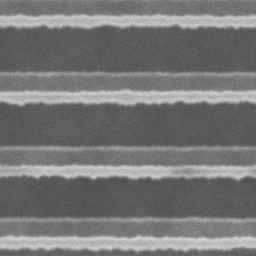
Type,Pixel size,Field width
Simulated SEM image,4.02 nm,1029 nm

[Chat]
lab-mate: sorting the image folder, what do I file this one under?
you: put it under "lines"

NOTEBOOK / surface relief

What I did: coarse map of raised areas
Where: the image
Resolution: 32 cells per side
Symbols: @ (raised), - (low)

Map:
@@@@@@@@@@@@@@@@@@@@@@@@@@@@@@@@
@@@@@@@@@@@@@@@@@@@@@@@@@@@@@@@@
@@@@@@@@@@@@@@@@@@@@@@@@@@@@@@@@
--------------------------------
--------------------------------
--------------------------------
--------------------------------
--------------------------------
--------------------------------
@@@@@@@@@@@@@@@@@@@@@@@@@@@@@@@@
@@@@@@@@@@@@@@@@@@@@@@@@@@@@@@@@
@@@@@@@@@@@@@@@@@@@@@@@@@@@@@@@@
@@@@@@@@@@@@@@@@@@@@@@@@@@@@@@@@
--------------------------------
--------------------------------
--------------------------------
--------------------------------
--------------------------------
@@@@@@@@----@@@----@@@--@@---@@@
@@@@@@@@@@@@@@@@@@@@@@@@@@@@@@@@
@@@@@@@@@@@@@@@@@@@@@@@@@@@@@@@@
@@@@@@@@@@@@@@@@@@@@@@@@@@@@@@@@
--------------------------------
--------------------------------
--------------------------------
--------------------------------
--------------------------------
@@@@@@@@@@@@@@@@@@@@@@@@@@@@@@-@
@@@@@@@@@@@@@@@@@@@@@@@@@@@@@@@@
@@@@@@@@@@@@@@@@@@@@@@@@@@@@@@@@
@@@@@@@@@@@@@@@@@@@@@@@@@@@@@@@@
--------------------------------